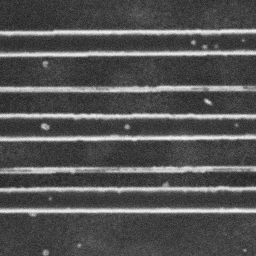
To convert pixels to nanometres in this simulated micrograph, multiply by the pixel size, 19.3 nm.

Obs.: lines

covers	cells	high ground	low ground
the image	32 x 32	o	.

................................
................................
................................
................................
oooooooooooooooooooooooooooooooo
oooooooooooooooooooooooooooooooo
oooooooooooooooooooooooooooooooo
................................
................................
................................
................................
................................
................................
................................
ooooooooooo.....ooooo..o........
oooooooooooooooooooooooooooooooo
oooooooooooooooooooooooooooooooo
................................
................................
................................
................................
...o..o.........................
................................
................................
oooooooooooooooooooooooooooooooo
oooooooooooooooooooooooooooooooo
................................
................................
................................
................................
................................
................................